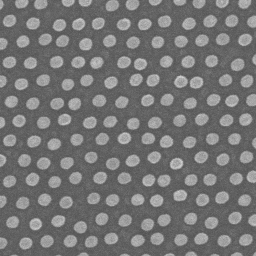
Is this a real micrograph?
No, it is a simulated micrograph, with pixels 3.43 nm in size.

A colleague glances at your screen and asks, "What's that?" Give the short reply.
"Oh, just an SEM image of a regular array of raised bodies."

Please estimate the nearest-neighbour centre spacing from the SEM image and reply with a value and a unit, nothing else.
0.0674 microns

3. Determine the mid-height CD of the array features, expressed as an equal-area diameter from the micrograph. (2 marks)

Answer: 41.6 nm